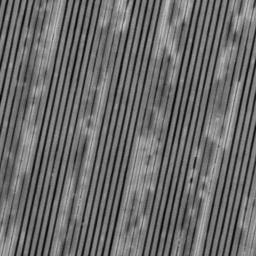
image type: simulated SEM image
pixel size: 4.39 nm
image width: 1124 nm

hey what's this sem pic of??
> parallel lines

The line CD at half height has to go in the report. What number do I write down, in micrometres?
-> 0.0242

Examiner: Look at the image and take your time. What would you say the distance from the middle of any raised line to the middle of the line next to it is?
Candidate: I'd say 28.8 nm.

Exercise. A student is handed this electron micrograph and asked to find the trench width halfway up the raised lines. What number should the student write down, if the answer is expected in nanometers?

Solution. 8